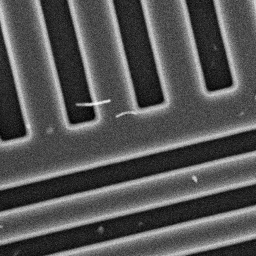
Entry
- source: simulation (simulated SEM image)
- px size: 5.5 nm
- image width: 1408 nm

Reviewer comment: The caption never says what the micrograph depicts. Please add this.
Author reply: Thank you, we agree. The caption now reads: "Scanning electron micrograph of groups of lines, slits or small figures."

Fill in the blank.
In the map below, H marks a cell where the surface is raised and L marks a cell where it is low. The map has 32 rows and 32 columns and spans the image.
HHHHHLLLLHHHHHLLLLHHHHHLLLLHHHHH
HHHHHLLLLHHHHHLLLLHHHHHLLLLHHHHH
HHHHHLLLLHHHHHLLLLHHHHHHLLLHHHHH
HHHHHHLLLHHHHHHLLLLHHHHHLLLLHHHH
LHHHHHLLLLHHHHHLLLLHHHHHLLLLHHHH
LHHHHHLLLLHHHHHLLLLHHHHHLLLLHHHH
LHHHHHLLLLHHHHHLLLLHHHHHLLLLHHHH
LHHHHHLLLLLHHHHHLLLLHHHHHLLLLHHH
LLHHHHHLLLLHHHHHLLLLHHHHHLLLLHHH
LLHHHHHLLLLHHHHHLLLLHHHHHLLLLHHH
LLHHHHHLLLLHHHHHLLLLHHHHHLLLLHHH
LLHHHHHHLLLHHHHHHLLLLHHHHHLHHHHH
LLLHHHHHLLLLHHHHHLLLLHHHHHHHHHHH
LLLHHHHHLLLLHHHHHLLHHHHHHHHHHHHH
LLLHHHHHLLLLHHHHHHHHHHHHHHHHHHHH
LLLHHHHHHLLHHHHHHHHHHHHHHHHHHHHH
LLLLHHHHHHHHHHHHHHHHHHHHHHHHHLLL
LLHHHHHHHHHHHHHHHHHHHHHHHLLLLLLL
HHHHHHHHHHHHHHHHHHHHHLLLLLLLLLLL
HHHHHHHHHHHHHHHHHLLLLLLLLLLLLLHH
HHHHHHHHHHHHHLLLLLLLLLLLLLHHHHHH
HHHHHHHHLLLLLLLLLLLLLLHHHHHHHHHH
HHHHHLLLLLLLLLLLLLHHHHHHHHHHHHHH
LLLLLLLLLLLLLHHHHHHHHHHHHHHHHLLL
LLLLLLLLLHHHHHHHHHHHHHHHHLLLLLLL
LLLLLHHHHHHHHHHHHHHHLLLLLLLLLLLL
LHHHHHHHHHHHHHHHLLLLLLLLLLLLLHHH
HHHHHHHHHHHHLLLLLLLLLLLLLHHHHHHH
HHHHHHHHLLLLLLLLLLLLLHHHHHHHHHHH
HHHHLLLLLLLLLLLLLHHHHHHHHHHHHHHH
LLLLLLLLLLLLLHHHHHHHHHHHHHHHLLLL
LLLLLLLLLHHHHHHHHHHHHHHHLLLLLLLL